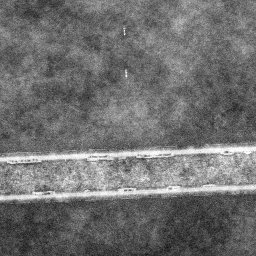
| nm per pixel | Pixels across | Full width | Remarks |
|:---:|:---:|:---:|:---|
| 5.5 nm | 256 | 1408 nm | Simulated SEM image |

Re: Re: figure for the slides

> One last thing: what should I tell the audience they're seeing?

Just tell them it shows one or a few lines or trenches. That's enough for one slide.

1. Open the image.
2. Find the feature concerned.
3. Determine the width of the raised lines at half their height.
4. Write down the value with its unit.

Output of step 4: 0.211 µm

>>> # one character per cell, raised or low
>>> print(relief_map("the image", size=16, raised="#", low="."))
................
................
................
................
................
................
................
................
................
............####
################
################
................
................
................
................